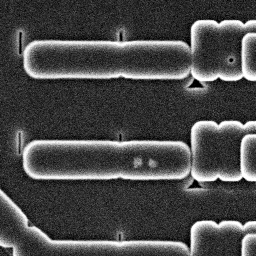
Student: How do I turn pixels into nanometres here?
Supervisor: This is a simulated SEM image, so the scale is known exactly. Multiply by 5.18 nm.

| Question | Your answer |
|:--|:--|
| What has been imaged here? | wiring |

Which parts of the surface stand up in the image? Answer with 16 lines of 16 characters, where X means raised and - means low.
----------------
------------XXXX
------------XXXX
--XXXXXXXXXXXXXX
--XXXXXXXXXXXXXX
----------------
----------------
----------------
------------XXXX
--XXXXXXXXXXXXXX
--XXXXXXXXXXXXXX
----------------
X---------------
X---------------
XXX---------XXXX
XXXXXXXXXXXXXXXX